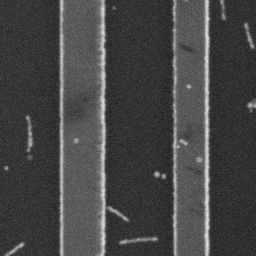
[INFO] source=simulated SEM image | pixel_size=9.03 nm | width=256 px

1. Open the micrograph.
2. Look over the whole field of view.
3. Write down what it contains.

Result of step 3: lines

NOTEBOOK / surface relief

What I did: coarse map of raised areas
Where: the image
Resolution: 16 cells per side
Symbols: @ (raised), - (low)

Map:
----@@@----@@---
----@@-----@@---
----@@-----@@---
----@@@----@@---
----@@@----@@---
----@@@----@@---
----@@-----@@---
----@@@----@@---
----@@@----@@---
----@@@----@@---
----@@@----@@---
----@@@----@@---
----@@@----@@---
----@@@----@@---
----@@@----@@---
----@@@----@@---